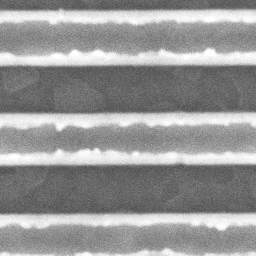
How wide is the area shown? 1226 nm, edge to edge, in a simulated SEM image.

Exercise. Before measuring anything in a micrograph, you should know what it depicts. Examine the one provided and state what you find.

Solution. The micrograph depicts one or a few lines or trenches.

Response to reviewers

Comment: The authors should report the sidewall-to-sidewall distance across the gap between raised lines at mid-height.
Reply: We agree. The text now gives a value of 56.5 px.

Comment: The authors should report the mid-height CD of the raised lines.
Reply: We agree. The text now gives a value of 218 nm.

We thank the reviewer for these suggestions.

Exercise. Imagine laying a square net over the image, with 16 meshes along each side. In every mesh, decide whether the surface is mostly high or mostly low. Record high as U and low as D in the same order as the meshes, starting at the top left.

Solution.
DDDDDDDDDDDDDDDD
UUUUUUUUUUUUUUUU
UUUUUUUUUUUUUUUU
UUUUUUUUUUUUUUUU
DDDDDDDDDDDDDDDD
DDDDDDDDDDDDDDDD
DDDDDDDDDDDDDDDD
UUUUUUUUUUUUUUUU
UUUUUUUUUUUUUUUU
UUUUUUUUUUUUUUUU
DDDDDDDDDDDDDDDD
DDDDDDDDDDDDDDDD
DDDDDDDDDDDDDDDD
DDDDDDDDDDDDDDDD
UUUUUUUUUUUUUUUU
UUUUUUUUUUUUUUUU